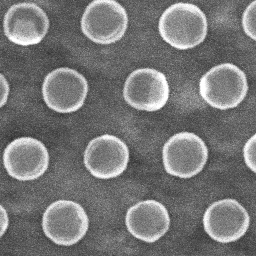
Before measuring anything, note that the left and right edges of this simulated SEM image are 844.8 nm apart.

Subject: a regular array of raised bodies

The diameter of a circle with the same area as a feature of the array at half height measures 139 nm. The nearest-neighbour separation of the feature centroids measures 75.6 px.